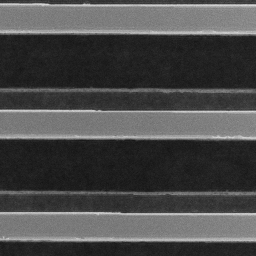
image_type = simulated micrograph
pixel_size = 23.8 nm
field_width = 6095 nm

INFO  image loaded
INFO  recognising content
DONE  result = lines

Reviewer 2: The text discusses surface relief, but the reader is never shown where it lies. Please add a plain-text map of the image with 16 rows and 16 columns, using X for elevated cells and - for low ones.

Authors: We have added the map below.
XXXXXXXXXXXXXXXX
XXXXXXXXXXXXXXXX
----------------
----------------
----------------
----------------
XXXXXXXXXXXXXXXX
XXXXXXXXXXXXXXXX
XXXXXXXXXXXXXXXX
----------------
----------------
----------------
XXXXXXXXXXXXXXXX
XXXXXXXXXXXXXXXX
XXXXXXXXXXXXXXXX
----------------